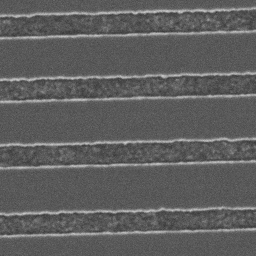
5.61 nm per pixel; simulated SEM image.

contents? lines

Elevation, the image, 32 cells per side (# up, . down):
################################
###################.............
................................
................................
.........#######################
################################
################################
################################
################################
#######################.........
................................
................................
......#.########################
################################
################################
################################
################################
###############################.
................................
................................
..................##############
################################
################################
################################
################################
################################
############....................
................................
................................
################################
################################
################################